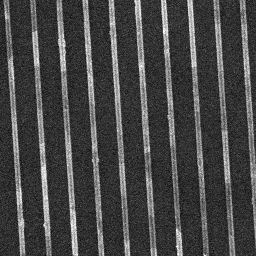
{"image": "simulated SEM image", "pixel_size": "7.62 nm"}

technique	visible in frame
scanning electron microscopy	parallel lines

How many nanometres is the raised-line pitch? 199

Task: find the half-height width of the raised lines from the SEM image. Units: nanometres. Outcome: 32.3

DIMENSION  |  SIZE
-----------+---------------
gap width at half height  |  170 nm